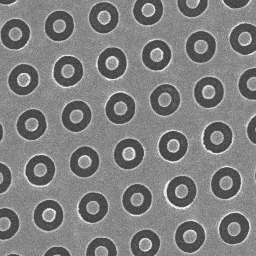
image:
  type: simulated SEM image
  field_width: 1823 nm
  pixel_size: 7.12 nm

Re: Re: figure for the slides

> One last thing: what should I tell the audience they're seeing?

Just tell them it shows a regular array of ring-shaped grooves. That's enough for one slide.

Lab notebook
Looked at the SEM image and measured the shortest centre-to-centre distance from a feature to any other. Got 0.32 um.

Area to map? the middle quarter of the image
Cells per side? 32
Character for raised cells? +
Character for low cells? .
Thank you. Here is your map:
++...+++...++...++++......++++++
+++..++++......+++++++..++++++++
++...++++......+++++++++++++++++
....+++++++..+++++++++++++++++++
....++++++++++++++++++++++++++++
..++++++++++++++++++++++...+++++
++++++++++++++++++++++......++++
++++++++++++....++++++..++...+++
+++++++++++......++++...+++..+++
++...++++++.......++++..+++..+++
......++++...+++..++++..++...+++
.......+++...+++..++++......++++
..+++..+++...++...+++++....+++++
..+++..++++......+++++++++++++++
..++...+++++....++++++++++++++++
......++++++++++++++++++++++++++
+....+++++++++++++++++++++++++++
+++++++++++++++++++++++++.....++
++++++++++++++++++++++++.......+
++++++++++++++.....+++++..+++..+
+++++.+++++++.......++++..+++..+
+++.....+++++..+++..++++..++...+
++......++++...+++..++++......++
++..+++..++++..++...+++++....+++
+...+++..++++......+++++++++++++
+...++...+++++....++++++++++++++
++......++++++++++++++++++++++++
+++....+++++++++++++++++++++++++
++++++++++++++++++++++++++++....
+++++++++++++++++++++++++++.....
+++++++++++++++++...++++++...+..
+++++++++++++++......+++++..+++.